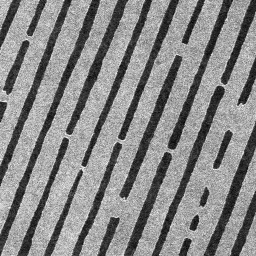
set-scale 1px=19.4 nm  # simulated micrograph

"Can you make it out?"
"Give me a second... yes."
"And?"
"parallel lines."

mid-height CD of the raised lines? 317 nm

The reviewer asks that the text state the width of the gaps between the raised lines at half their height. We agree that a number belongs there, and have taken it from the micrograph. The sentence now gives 161 nm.